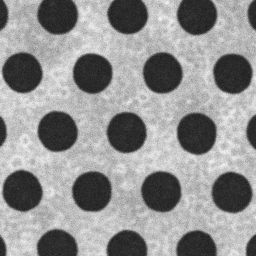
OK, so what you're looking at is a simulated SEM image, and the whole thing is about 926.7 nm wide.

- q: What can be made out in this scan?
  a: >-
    a regular array of holes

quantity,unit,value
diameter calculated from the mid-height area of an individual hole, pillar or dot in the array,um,0.148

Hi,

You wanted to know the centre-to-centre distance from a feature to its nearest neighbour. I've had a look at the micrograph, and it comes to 247 nanometers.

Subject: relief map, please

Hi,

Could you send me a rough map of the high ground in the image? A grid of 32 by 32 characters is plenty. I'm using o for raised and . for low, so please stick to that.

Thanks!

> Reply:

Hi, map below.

.oooo....ooooo....oooo.....oooo.
.oooo.....ooo......ooo.....oooo.
.oooo.....oooo.....ooo.....oooo.
ooooo....ooooo....ooooo....ooooo
oooooooooooooooooooooooooooooooo
oooooooooooooooooooooooooooooooo
oooooooooooooooooooooooooooooooo
o....ooooo...ooooo....ooooo....o
.....oooo.....oooo.....oooo.....
.....oooo.....oooo.....oooo.....
o....oooo.....oooo....ooooo....o
oo..ooooooo..oooooo..ooooooo..oo
oooooooooooooooooooooooooooooooo
oooooooooooooooooooooooooooooooo
ooooo....ooooo...oooooo...oooooo
.oooo....ooooo....oooo.....oooo.
.oooo.....ooo.....oooo.....oooo.
.oooo.....oooo....oooo.....oooo.
oooooo...ooooo....ooooo...oooooo
oooooooooooooooooooooooooooooooo
oooooooooooooooooooooooooooooooo
oo..ooooooo.ooooooo..ooooooo.ooo
o....oooo.....oooo....ooooo....o
.....oooo.....oooo.....oooo....o
.....oooo.....oooo.....ooo......
o....oooo.....oooo....ooooo....o
ooooooooooo.oooooooo.ooooooo..oo
oooooooooooooooooooooooooooooooo
oooooooooooooooooooooooooooooooo
ooooo....ooooo....ooooo...oooooo
.oooo.....ooo.....oooo.....oooo.
.oooo.....ooo.....oooo.....oooo.